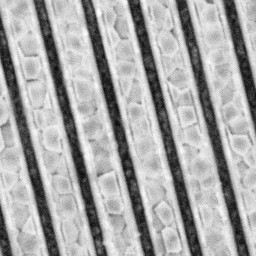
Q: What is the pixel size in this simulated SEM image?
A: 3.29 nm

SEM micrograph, parallel lines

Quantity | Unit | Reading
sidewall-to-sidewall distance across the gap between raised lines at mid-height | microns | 0.0482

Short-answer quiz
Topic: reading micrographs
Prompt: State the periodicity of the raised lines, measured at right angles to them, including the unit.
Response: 151 nanometres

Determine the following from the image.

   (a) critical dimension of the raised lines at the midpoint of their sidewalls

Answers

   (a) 102 nanometres